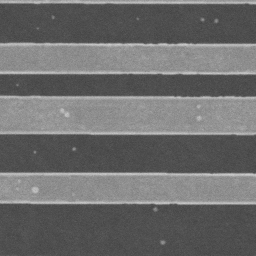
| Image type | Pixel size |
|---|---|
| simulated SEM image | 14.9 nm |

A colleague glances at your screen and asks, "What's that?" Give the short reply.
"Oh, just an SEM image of lines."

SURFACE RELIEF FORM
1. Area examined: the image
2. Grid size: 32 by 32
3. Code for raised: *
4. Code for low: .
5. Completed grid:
................................
................................
................................
................................
................................
................................
********************************
********************************
********************************
................................
................................
................................
********************************
********************************
********************************
********************************
********************************
................................
................................
................................
................................
................................
********************************
********************************
********************************
................................
................................
................................
................................
................................
................................
................................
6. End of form